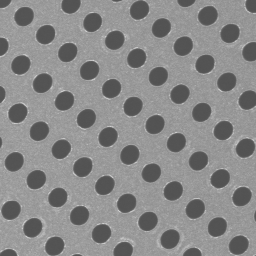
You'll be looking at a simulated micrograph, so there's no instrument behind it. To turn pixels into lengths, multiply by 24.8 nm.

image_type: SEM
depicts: a regular array of holes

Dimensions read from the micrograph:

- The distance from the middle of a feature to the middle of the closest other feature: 698 nm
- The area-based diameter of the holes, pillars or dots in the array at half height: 461 nanometres